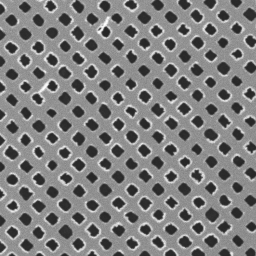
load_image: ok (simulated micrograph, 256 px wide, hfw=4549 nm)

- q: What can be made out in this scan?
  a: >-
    a regular array of holes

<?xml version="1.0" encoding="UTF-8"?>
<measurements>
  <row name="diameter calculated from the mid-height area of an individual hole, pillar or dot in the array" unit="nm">197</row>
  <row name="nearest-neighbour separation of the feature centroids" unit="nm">322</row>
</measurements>